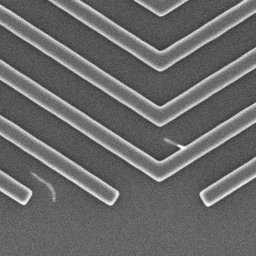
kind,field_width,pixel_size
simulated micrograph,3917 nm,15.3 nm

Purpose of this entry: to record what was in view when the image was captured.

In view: groups of lines, slits or small figures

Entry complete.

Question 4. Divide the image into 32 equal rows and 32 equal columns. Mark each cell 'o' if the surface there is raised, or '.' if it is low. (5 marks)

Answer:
.......oooo.......ooooo.......oo
o.......oooo.......oo.......oooo
ooo.......oooo............oooo..
.oooo......oooo..........oooo...
..oooo.......oooo......oooo.....
....oooo.......ooo....oooo......
.....oooo.......oooooooo.......o
.......oooo.......oooo.......ooo
oo......oooo.......oo.......oooo
ooo.......oooo............oooo..
.oooo.......ooo..........oooo...
..oooo.......oooo......oooo.....
....oooo.......ooo....oooo......
......ooo.......oooooooo.......o
.......oooo.......oooo.......ooo
oo.......oooo......oo.......oooo
ooo.......oooo............oooo..
.oooo.......oooo.........ooo....
...oooo......oooo......oooo.....
....oooo.......oooo..oooo.......
......oooo......oooooooo.......o
.......oooo.......oooo.......ooo
oo.......oooo......o........ooo.
ooo.......oooo............oooo..
.ooo........ooo..........ooo....
.............o............o.....
................................
................................
................................
................................
................................
................................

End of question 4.